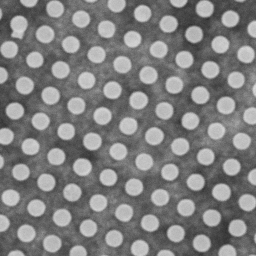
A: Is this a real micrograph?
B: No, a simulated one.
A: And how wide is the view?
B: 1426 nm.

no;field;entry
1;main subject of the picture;a regular array of raised bodies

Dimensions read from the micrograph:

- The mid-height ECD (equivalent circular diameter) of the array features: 91.6 nanometres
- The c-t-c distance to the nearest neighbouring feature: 152 nm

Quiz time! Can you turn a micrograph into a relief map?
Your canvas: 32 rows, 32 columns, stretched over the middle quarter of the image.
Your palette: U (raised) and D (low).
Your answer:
UDDDDDDDDDDDDUUUUDDDDDDDDDDDDUUD
UDDDDDDDDDDDDUUUDDDDUUUDDDDDDDDD
UDDDUUUDDDDDDDDDDDDUUUUDDDDDDDDD
DDDDUUUUDDDDDDDDDDDUUUUDDDDUDDDD
DDDDUUUUDDDDDDDDDDDDUUDDDDUUUDDD
DDDDUUUDDDUUUUDDDDDDDDDDDDUUUUDD
DDDDDDDDDDUUUUDDDDDDDDDDDDUUUDDD
DDDDDDDDDDUUUUDDDUUUDDDDDDDDDDDD
DDDDDDDDDDDDUDDDDUUUUDDDDDDDDDDD
DUUUUDDDDDDDDDDDDUUUUDDDDDDDDDDD
DUUUUDDDDDDDDDDDDUUUDDDDUUUDDDDD
DUUUUDDDUUUDDDDDDDDDDDDUUUUDDDDD
DDDDDDDDUUUUDDDDDDDDDDDUUUUDDDDU
DDDDDDDDUUUUDDDDDDDDDDDDUUDDDDUU
DDDDDDDDUUUDDDUUUUDDDDDDDDDDDDUU
UUDDDDDDDDDDDDUUUUDDDDDDDDDDDDUU
UUDDDDDDDDDDDDUUUUDDDUUUDDDDDDDD
UUDDDDUUDDDDDDDDDDDDDUUUUDDDDDDD
UUDDDUUUUDDDDDDDDDDDDUUUUDDDDDDD
DDDDDUUUUDDDDDDDDDDDDUUUDDDUUUUD
DDDDDUUUUDDDUUUDDDDDDDDDDDDUUUUD
DDDDDDDDDDDDUUUUDDDDDDDDDDDUUUUD
DDDDDDDDDDDDUUUUDDDDDDDDDDDDUUDD
DDDDDDDDDDDDDUUDDDUUUUDDDDDDDDDD
DDDUUUDDDDDDDDDDDDUUUUDDDDDDDDDD
DDUUUUUDDDDDDDDDDDUUUUDDDUUUDDDD
DDDUUUUDDDUUDDDDDDDDDDDDDUUUDDDD
DDDDUUDDDUUUUDDDDDDDDDDDDUUUDDDD
DDDDDDDDDUUUUDDDDDDDDDDDDUUUDDDU
DDDDDDDDDDUUUDDDUUUDDDDDDDDDDDDU
DDDDDDDDDDDDDDDUUUUUDDDDDDDDDDDU
DDDDDDDDDDDDDDDDUUUUDDDUUDDDDDDD